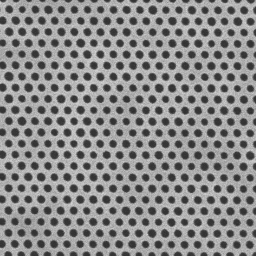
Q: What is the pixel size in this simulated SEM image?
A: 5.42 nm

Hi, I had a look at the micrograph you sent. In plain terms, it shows a regular array of holes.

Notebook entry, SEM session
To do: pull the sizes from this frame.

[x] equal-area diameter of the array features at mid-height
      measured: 42.4 nanometres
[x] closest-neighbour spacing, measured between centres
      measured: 69.3 nm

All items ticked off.